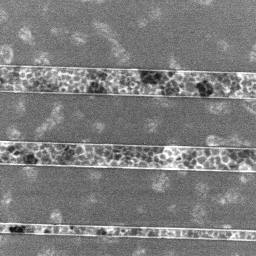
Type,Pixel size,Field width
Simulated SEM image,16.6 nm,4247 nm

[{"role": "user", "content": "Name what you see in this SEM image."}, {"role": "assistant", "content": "one or a few lines or trenches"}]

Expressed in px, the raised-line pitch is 74.8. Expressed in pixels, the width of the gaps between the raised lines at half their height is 50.